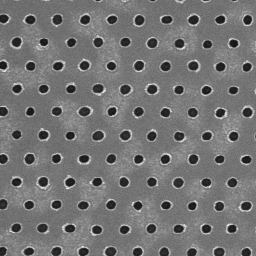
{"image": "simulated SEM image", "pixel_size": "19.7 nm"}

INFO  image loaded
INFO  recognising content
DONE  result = a regular array of holes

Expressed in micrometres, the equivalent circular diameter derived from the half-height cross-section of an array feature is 0.187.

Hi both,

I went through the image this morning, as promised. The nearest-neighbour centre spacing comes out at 518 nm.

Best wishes